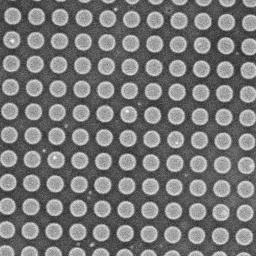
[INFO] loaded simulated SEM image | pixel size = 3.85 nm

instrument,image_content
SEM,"an array of small figures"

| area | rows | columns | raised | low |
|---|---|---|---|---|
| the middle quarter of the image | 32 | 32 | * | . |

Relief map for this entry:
*..****..****..***...***..****..
...***...***...***...***..****..
................**...***...***..
................................
...**...........................
...***...***...***...***...***..
...***...***..****..****..****..
...***...***..****..****..****..
..........*.....*....**....***..
................................
...**...........................
..****..****..****...***...**...
..****..****..****..****..****..
...***...***..****..****..****..
...............**....**....**...
................................
...**...........................
..****..****..****..***....**...
..****..****..****..****..****..
...***..****..****..****..****..
...............**....**....**...
................................
...**....**.....................
..****..****..****..***...***...
..****..****..****..****..****..
...**...****..****..****..****..
.....................**....**...
................................
...**....**.....................
..****..****..***...***...***...
..****..****..****..****..***..*
..***...***...***...***...***...